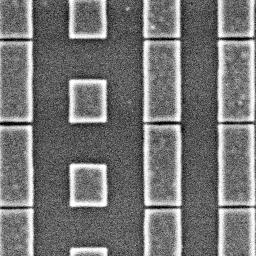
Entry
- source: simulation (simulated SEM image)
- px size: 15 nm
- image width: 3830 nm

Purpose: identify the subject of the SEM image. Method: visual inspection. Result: wiring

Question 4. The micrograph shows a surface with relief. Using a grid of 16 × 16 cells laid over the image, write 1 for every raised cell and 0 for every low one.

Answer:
1100111001100011
1100111001100011
1100000001100011
1100000001100011
1100000001100011
1100111001100011
1100111001100011
1100010001100011
1100000001100011
1100000001100011
1100010001100011
1100111001100011
1100011001100011
1100000001100011
1100000001100011
1100000001100011